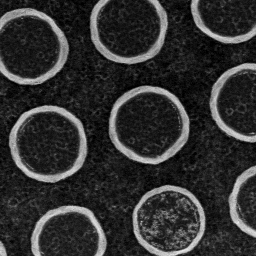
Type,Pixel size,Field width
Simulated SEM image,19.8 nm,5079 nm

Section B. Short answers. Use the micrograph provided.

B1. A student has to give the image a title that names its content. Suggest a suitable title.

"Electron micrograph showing raised bodies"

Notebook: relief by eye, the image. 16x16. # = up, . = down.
......####..####
###...####...###
####..####......
####...##.......
###...........##
..............##
.......####..###
.####..#####..##
.####..####....#
.####...###.....
.####...........
...............#
.........###...#
...###...####..#
..####...###....
..####....##....